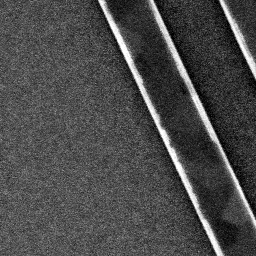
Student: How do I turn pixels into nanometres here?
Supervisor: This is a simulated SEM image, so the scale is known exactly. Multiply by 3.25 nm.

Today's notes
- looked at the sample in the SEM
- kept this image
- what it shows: one or a few lines or trenches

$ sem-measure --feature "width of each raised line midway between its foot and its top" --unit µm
0.156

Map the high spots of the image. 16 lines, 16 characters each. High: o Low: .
......oooo....oo
.......ooo....oo
.......oooo....o
........ooo....o
........oooo....
.........ooo....
.........oooo...
..........ooo...
..........ooo...
...........ooo..
...........ooo..
............ooo.
............ooo.
............oooo
.............ooo
.............ooo